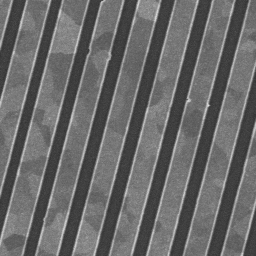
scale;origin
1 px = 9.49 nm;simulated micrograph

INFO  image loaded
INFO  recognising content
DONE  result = parallel lines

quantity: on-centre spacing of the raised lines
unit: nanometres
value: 340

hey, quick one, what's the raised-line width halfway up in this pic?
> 200 nanometers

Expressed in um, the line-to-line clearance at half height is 0.145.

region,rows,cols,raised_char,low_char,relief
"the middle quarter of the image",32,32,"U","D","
UUDDDUUUUUUDDDDUUUUUDDDDUUUUUDDD
UDDDDUUUUUDDDDUUUUUDDDDUUUUUUDDD
UDDDDUUUUUDDDDUUUUUDDDDUUUUUUDDD
UDDDDUUUUUDDDDUUUUUDDDDUUUUUDDDD
UDDDUUUUUDDDDUUUUUUDDDDUUUUUDDDD
UDDDUUUUUDDDDUUUUUDDDDUUUUUUDDDD
DDDDUUUUUDDDDUUUUUDDDDUUUUUDDDDU
DDDDUUUUUDDDDUUUUUDDDDUUUUUDDDDU
DDDUUUUUDDDDUUUUUUDDDDUUUUUDDDDU
DDDUUUUUDDDDUUUUUDDDDUUUUUUDDDDU
DDDUUUUUDDDDUUUUUDDDDUUUUUDDDDUU
DDDUUUUUDDDDUUUUUDDDDUUUUUDDDDUU
DDUUUUUDDDDUUUUUUDDDDUUUUUDDDDUU
DDUUUUUDDDDUUUUUUDDDUUUUUUDDDDUU
DDUUUUUDDDDUUUUUDDDDUUUUUDDDDUUU
DDUUUUUDDDDUUUUUDDDDUUUUUDDDDUUU
DUUUUUDDDDUUUUUUDDDUUUUUUDDDDUUU
DUUUUUDDDDUUUUUDDDDUUUUUUDDDDUUU
DUUUUUDDDDUUUUUDDDDUUUUUDDDDUUUU
UUUUUUDDDDUUUUUDDDDUUUUUDDDDUUUU
UUUUUDDDDUUUUUUDDDUUUUUUDDDDUUUU
UUUUUDDDDUUUUUDDDDUUUUUUDDDDUUUU
UUUUUDDDDUUUUUDDDDUUUUUDDDDUUUUU
UUUUUDDDDUUUUUDDDDUUUUUDDDDUUUUU
UUUUDDDDUUUUUDDDDUUUUUUDDDDUUUUU
UUUUDDDDUUUUUDDDDUUUUUUDDDDUUUUU
UUUUDDDDUUUUUDDDDUUUUUDDDDUUUUUU
UUUUDDDDUUUUUDDDDUUUUUDDDDUUUUUD
UUUDDDDUUUUUUDDDUUUUUUDDDDUUUUUD
UUUDDDDUUUUUDDDDUUUUUUDDDDUUUUUD
UUUDDDDUUUUUDDDDUUUUUDDDDUUUUUUD
UUDDDDUUUUUUDDDDUUUUUDDDDUUUUUDD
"